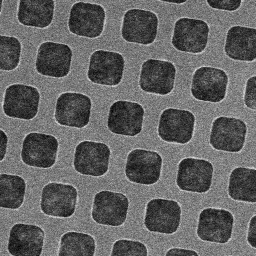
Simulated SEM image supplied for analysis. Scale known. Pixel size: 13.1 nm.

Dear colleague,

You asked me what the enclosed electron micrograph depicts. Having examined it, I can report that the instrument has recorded a regular array of holes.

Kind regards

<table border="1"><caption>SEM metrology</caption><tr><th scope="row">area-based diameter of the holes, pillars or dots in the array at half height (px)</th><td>37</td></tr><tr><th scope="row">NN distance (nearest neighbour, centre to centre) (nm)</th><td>682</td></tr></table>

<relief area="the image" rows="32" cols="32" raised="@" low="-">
@@-----@@---@@@@@@@@@@@@@@----@@
@@-----@@----@@@---@@@@@@@@@@@@@
@@-----@@----@@-----@@---@@@@@@@
@@@@@@@@@----@@-----@@----@@@--@
-@@@@@@@@@--@@@-----@@----@@----
---@@---@@@@@@@@@@@@@@----@@----
---@@----@@@--@@@@@@@@@--@@@----
--@@-----@@----@@@@-@@@@@@@@@@--
--@@@----@@----@@@----@@@--@@@@@
@@@@@@--@@@----@@@----@@----@@@@
@@@@@@@@@@@@---@@-----@@----@@@-
@----@@@@@@@@@@@@@---@@@----@@@-
@----@@----@@@@@@@@@@@@@@---@@@-
-----@@----@@@----@@@@@@@@@@@@@-
@---@@@----@@@----@@----@@@@@@@@
@@@@@@@@---@@-----@@----@@@----@
@@@@@@@@@@@@@@---@@@----@@-----@
-@@----@@@@@@@@@@@@@----@@-----@
-@@----@@-----@@@@@@@@@@@@@---@@
-@@----@@-----@@----@@@@@@@@@@@@
@@@----@@-----@@----@@----@@@@@@
@@@@@@@@@@---@@@----@@-----@@---
---@@@@@@@@@@@@@----@@----@@@---
---@@----@@@@@@@@@@@@@@---@@@---
---@@-----@@----@@@@@@@@@@@@@---
---@@----@@@----@@@---@@@@@@@@@@
@@@@@----@@@----@@-----@@----@@@
@@@@@@@@@@@@----@@----@@@----@@-
@----@@@@@@@@@@@@@----@@@----@@-
@-----@@---@@@@@@@@@@@@@@----@@-
@----@@-----@@----@@@@@@@@@@@@@-
@----@@-----@@----@@@---@@@@@@@@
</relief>